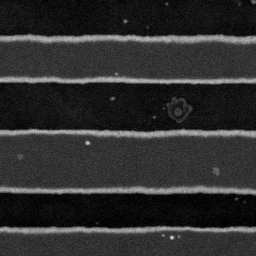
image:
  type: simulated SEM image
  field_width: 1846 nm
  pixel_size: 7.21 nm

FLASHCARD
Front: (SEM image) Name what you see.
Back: lines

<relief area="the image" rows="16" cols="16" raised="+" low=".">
................
................
++++++++++++++++
++++++++++++++++
++++++++++++++++
................
................
................
++++++++++++++++
++++++++++++++++
++++++++++++++++
++++++++++++++++
................
................
++++++++++++++++
++++++++++++++++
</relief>